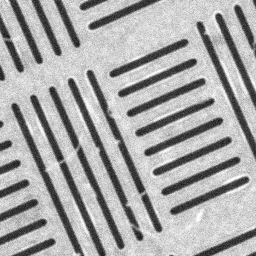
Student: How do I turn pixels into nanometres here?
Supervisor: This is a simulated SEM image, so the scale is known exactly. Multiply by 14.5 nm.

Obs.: groups of lines, slits or small figures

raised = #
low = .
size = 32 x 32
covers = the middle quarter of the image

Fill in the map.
##############......#######.....
######.#####......#######.....##
#####...###....#######......####
#.####..####.#######......######
#..###...#########......#######.
#...###..#######......#######...
##..###...####.....########.....
##..###...###....########.....##
##...###..####.########.....####
###..###...#########......######
###...###..#######......#######.
.###..###..#####.....########...
.###...###..####...#######......
.###...###..############......##
..###...###..#########......####
..###...###...######......######
...###..####..####.....########.
#..###...###..####...########...
#...###..###...###########......
##..###...###..#########......##
##..####..###...######.....#####
###..###...###..####......######
###..####..###...###...########.
###...###..####..###########....
####..####..###...########......
.###...###..####..######......##
..###..###...###..####.....#####
..###...###..###...###...#######
..####..###...###..###########..
...###..####..###...########....
#..####..###...###..######.....#
#...###..####..###...####....###